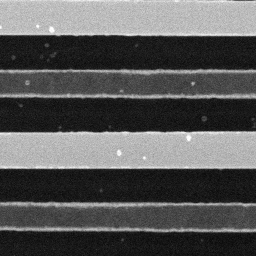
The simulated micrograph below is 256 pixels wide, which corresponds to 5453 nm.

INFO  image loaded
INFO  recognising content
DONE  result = lines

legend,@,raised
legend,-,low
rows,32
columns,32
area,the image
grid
@@@@@@@@@@@@@@@@@@@@@@@@@@@@@@@@
@@@@@@@@@@@@@@@@@@@@@@@@@@@@@@@@
@@@@@@@@@@@@@@@@@@@@@@@@@@@@@@@@
@@@@@@@@@@@@@@@@@@@@@@@@@@@@@@@@
--------------------------------
--------------------------------
--------------------------------
--------------------------------
--------------------------------
@@@@@@@@@@@@@@@@@@@@@@@@@@@@@@@@
@@@@@@@@@@@@@@@@@@@@@@@@@@@@@@@@
@@@@@@@@@@@@@@@@@@@@@@@@@@@@@@@@
--------------------------------
--------------------------------
--------------------------------
--------------------------------
--------------------------------
@@@@@@@@@@@@@@@@@@@@@@@@@@@@@@@@
@@@@@@@@@@@@@@@@@@@@@@@@@@@@@@@@
@@@@@@@@@@@@@@@@@@@@@@@@@@@@@@@@
@@@@@@@@@@@@@@@@@@@@@@@@@@@@@@@@
--------------------------------
--------------------------------
--------------------------------
--------------------------------
@@@@@@@@@@@@@@@@@@@@@@@@@@@@@@@-
@@@@@@@@@@@@@@@@@@@@@@@@@@@@@@@@
@@@@@@@@@@@@@@@@@@@@@@@@@@@@@@@@
@@@@@@@@@@@@@@@@@@@@@@@@@@@@@@@@
--------------------------------
--------------------------------
--------------------------------